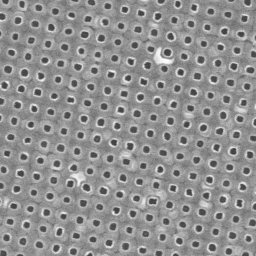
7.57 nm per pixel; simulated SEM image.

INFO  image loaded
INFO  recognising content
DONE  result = a regular array of holes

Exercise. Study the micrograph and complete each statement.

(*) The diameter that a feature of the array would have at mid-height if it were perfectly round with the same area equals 52.7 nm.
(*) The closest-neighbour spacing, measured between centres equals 0.124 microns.